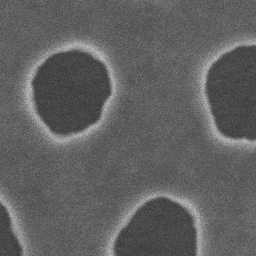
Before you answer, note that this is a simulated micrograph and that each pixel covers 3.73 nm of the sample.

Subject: holes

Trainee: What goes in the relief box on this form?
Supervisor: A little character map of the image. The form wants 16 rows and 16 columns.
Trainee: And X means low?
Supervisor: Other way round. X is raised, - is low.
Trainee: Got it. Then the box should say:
XXXXXXXXXXXXXXXX
XXXXXXXXXXXXXXXX
XXXXXXXXXXXXXXXX
XXX---XXXXXXXX--
XX-----XXXXXX---
XX-----XXXXXX---
XX-----XXXXXX---
XXX---XXXXXXX---
XXXXXXXXXXXXXX--
XXXXXXXXXXXXXXXX
XXXXXXXXXXXXXXXX
XXXXXXXXXXXXXXXX
XXXXXXXXX--XXXXX
-XXXXXXX----XXXX
-XXXXXXX----XXXX
-XXXXXX-----XXXX